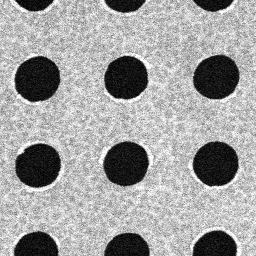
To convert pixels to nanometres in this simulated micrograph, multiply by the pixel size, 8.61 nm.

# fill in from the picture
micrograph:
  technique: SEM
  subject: holes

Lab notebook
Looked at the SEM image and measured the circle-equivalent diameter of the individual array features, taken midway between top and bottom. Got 390 nanometers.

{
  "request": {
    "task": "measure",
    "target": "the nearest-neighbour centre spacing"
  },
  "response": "0.744 um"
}